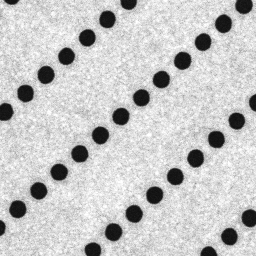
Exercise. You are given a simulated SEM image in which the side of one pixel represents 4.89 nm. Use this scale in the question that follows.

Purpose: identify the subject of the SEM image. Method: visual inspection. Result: a regular array of holes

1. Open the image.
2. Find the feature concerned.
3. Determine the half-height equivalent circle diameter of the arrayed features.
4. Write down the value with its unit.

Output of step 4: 85.5 nm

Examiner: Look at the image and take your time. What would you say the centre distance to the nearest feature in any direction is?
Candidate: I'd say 135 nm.